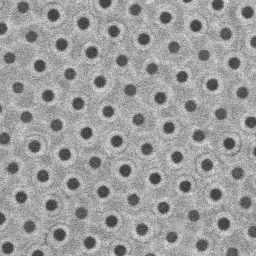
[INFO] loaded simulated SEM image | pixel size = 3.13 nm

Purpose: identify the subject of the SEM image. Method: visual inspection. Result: a regular array of holes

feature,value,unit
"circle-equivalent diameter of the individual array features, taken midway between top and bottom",38.6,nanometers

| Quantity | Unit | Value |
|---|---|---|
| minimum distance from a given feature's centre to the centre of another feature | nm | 95.4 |